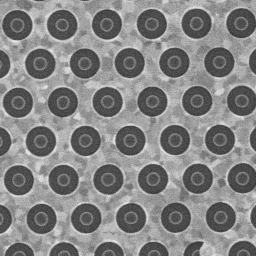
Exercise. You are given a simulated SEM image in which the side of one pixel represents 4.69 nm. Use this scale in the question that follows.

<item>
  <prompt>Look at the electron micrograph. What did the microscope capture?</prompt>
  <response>an array of small figures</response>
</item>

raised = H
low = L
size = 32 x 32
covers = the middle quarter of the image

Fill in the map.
HLLLLLLLLHHHHLLLLLLLHHHHLLLLLLLH
HHLLLLLLLHHHHLLLLLLLHHHHLLLLLLLH
HHLLLLLLHHHHHHLLLLLHHHHHHLLLLLHH
HHHHLLLHHHHHHHHLLLHHHHHHHHHLHHHH
HHHHHHHHHHHHHHHHHHHHHHHHHHHHHHHH
HHHHHHHHHHLHHHHHHHHHHHHHHHHHHHHH
LLHHHHHHLLLLLLHHHHHHLLLLLHHHHHHL
LLLHHHHLLLLLLLHHHHHLLLLLLLHHHHLL
LLLHHHHLLLLLLLLHHHLLLLLLLLHHHLLL
LLLLHHHLLLLLLLLHHHLLLLLLLLHHHLLL
LLLHHHHLLLLLLLLHHHLLLLLLLLHHHHLL
LLLHHHHLLLLLLLHHHHHLLLLLLHHHHHLL
LLHHHHHHLLLLLHHHHHHHLLLLLHHHHHHL
HHHHHHHHHHHHHHHHHHHHHHHHHHHHHHHH
HHHHHHHHHHHHHHHHHHHHHHHHHHHHHHHH
HHHHLLLHHHHHHHHLLLHHHHHHHHLLLLHH
HHHLLLLLHHHHHHLLLLLLHHHHHLLLLLLH
HHLLLLLLLHHHHLLLLLLLHHHHLLLLLLLH
HHLLLLLLLHHHHLLLLLLLLHHHLLLLLLLL
HLLLLLLLLHHHHLLLLLLLLHHHLLLLLLLL
HHLLLLLLLHHHHLLLLLLLHHHHLLLLLLLH
HHLLLLLLHHHHHHLLLLLLHHHHHLLLLLLH
HHHLLLLLHHHHHHHLLLLHHHHHHHLLLLHH
HHHHHHHHHHHHHHHHHHHHHHHHHHHHHHHH
HHHHHHHHHHHHHHHHHHHHHHHHHHHHHHHH
LLHHHHHHHLLLLHHHHHHHLLLLHHHHHHHL
LLLHHHHHLLLLLLHHHHHLLLLLLHHHHHLL
LLLHHHHLLLLLLLLHHHHLLLLLLLHHHHLL
LLLLHHHLLLLLLLLHHHLLLLLLLLHHHLLL
LLLLHHHLLLLLLLLHHHLLLLLLLLHHHHLL
LLLLHHHLLLLLLLLHHHHLLLLLLLHHHHLL
LLLHHHHHLLLLLLHHHHHLLLLLLHHHHHHL